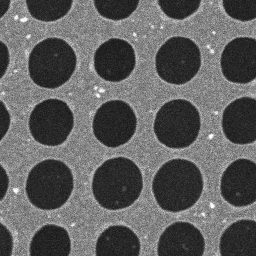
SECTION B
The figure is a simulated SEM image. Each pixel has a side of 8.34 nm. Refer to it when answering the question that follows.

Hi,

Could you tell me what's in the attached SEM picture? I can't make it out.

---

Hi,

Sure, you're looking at a regular array of holes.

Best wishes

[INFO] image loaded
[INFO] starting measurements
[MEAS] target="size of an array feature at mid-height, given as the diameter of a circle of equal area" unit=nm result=403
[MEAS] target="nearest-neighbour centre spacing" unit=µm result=0.503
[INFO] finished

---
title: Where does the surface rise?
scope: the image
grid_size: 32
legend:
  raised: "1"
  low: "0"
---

01100000011100000111000001110000
01110000011100000111000011110000
11111001111111011111111111111101
11111111111111111111111111111111
11111111111111111111111111111111
01111000011110001111000011110000
01110000011100000111000001110000
01110000001100000110000001110000
01110000011100000110000001110000
11110000011100001111000011110000
11111000111111111111110111111111
11111111111111111111111111111111
11111100111111111111110111111000
01110000011100001111000011110000
01110000011100000110000001110000
01110000011100000110000001110000
01110000011100000110000001110000
11110000111100001111000011111000
11111111111111111111100111111111
11111111111111111111111111111111
11111000111110000111000011111000
01110000011100000011000001110000
01100000011100000010000001110000
01100000011100000010000001100000
01100000011100000110000001110000
11110000111100001111000011111001
11111111111111111111101111111111
11111111111111111111111111111101
01111000111110001111100001110000
00110000011100000111000001110000
00110000011100000111000000100000
01110000011100000111000001110000